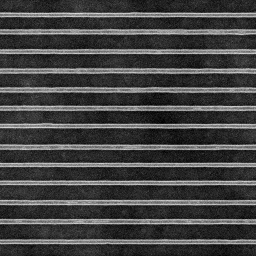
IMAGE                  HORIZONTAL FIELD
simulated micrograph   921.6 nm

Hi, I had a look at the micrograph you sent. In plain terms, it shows parallel lines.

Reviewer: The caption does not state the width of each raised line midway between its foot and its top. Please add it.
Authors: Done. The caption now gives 0.0162 µm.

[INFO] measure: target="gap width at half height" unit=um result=0.0522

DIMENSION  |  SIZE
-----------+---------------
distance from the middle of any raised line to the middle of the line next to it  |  68 nanometres